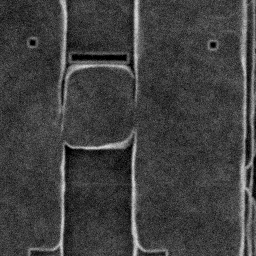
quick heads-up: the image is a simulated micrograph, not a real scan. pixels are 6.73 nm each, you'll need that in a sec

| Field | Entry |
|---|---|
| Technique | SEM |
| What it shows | wiring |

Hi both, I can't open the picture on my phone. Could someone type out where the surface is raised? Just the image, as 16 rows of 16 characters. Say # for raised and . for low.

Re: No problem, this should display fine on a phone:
####.....######.
####.....######.
####.....######.
####....#######.
###############.
###############.
###############.
###############.
###############.
####....#######.
####....#######.
####....#######.
####....#######.
####....#######.
####....#######.
####....#######.